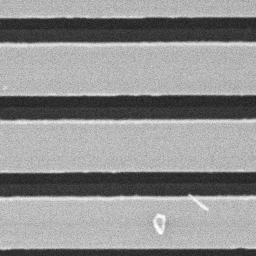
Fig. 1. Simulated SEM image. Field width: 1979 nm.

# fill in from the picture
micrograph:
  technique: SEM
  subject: lines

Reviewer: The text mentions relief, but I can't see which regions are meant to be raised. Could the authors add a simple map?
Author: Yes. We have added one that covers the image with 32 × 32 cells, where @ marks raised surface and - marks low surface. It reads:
@@@@@@@@@@@@@@@@@@@@@@@@@@@@@@@@
@@@@@@@@@@@@@@@@@@@@@@@@@@@@@@@@
--------------------------------
--------------------------------
--------------------------------
@@@@@@@@@@@@@@@@@@@@@@@@@@@@@@@@
@@@@@@@@@@@@@@@@@@@@@@@@@@@@@@@@
@@@@@@@@@@@@@@@@@@@@@@@@@@@@@@@@
@@@@@@@@@@@@@@@@@@@@@@@@@@@@@@@@
@@@@@@@@@@@@@@@@@@@@@@@@@@@@@@@@
@@@@@@@@@@@@@@@@@@@@@@@@@@@@@@@@
@@@@@@@@@@@@@@@@@@@@@@@@@@@@@@@@
--------------------------------
--------------------------------
--------------------------------
@@@@@@@@@@@@@@@@@@@@@@@@@@@@@@@@
@@@@@@@@@@@@@@@@@@@@@@@@@@@@@@@@
@@@@@@@@@@@@@@@@@@@@@@@@@@@@@@@@
@@@@@@@@@@@@@@@@@@@@@@@@@@@@@@@@
@@@@@@@@@@@@@@@@@@@@@@@@@@@@@@@@
@@@@@@@@@@@@@@@@@@@@@@@@@@@@@@@@
@@@@@@@@@@@-@@@-----------@-----
--------------------------------
--------------------------------
----------------@@-----@---@@-@@
@@@@@@@@@@@@@@@@@@@@@@@@@@@@@@@@
@@@@@@@@@@@@@@@@@@@@@@@@@@@@@@@@
@@@@@@@@@@@@@@@@@@@@@@@@@@@@@@@@
@@@@@@@@@@@@@@@@@@@@@@@@@@@@@@@@
@@@@@@@@@@@@@@@@@@@@@@@@@@@@@@@@
@@@@@@@@@@@@@@@@@@@@@@@@@@@@@@@@
--------------------------------